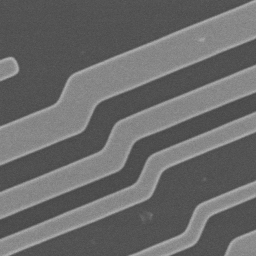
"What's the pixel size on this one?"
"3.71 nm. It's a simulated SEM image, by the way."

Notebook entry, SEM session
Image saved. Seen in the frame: groups of lines, slits or small figures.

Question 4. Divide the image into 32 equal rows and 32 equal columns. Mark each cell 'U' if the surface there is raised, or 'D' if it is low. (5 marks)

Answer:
DDDDDDDDDDDDDDDDDDDDDDDDDDDDDDDU
DDDDDDDDDDDDDDDDDDDDDDDDDDDDUUUU
DDDDDDDDDDDDDDDDDDDDDDDDDDUUUUUU
DDDDDDDDDDDDDDDDDDDDDDDUUUUUUUUU
DDDDDDDDDDDDDDDDDDDDDUUUUUUUUUUU
DDDDDDDDDDDDDDDDDDUUUUUUUUUUUUDD
DDDDDDDDDDDDDDDDUUUUUUUUUUUUDDDD
UUDDDDDDDDDDDUUUUUUUUUUUUDDDDDDD
UUDDDDDDDDDUUUUUUUUUUUUDDDDDDDDU
UUDDDDDDDUUUUUUUUUUUDDDDDDDDDUUU
DDDDDDDDUUUUUUUUUUDDDDDDDDUUUUUU
DDDDDDDDUUUUUUUUDDDDDDDDUUUUUUUU
DDDDDDDUUUUUUDDDDDDDDUUUUUUUUDDD
DDDDDDUUUUUUDDDDDDDUUUUUUUUDDDDD
DDDUUUUUUUUDDDDDUUUUUUUUDDDDDDDU
DUUUUUUUUUUDDDUUUUUUUUDDDDDDUUUU
UUUUUUUUUUDDDDUUUUUUDDDDDDUUUUUU
UUUUUUUUDDDDDUUUUDDDDDDUUUUUUDDD
UUUUUDDDDDDDDUUUDDDDDUUUUUUDDDDD
UUUDDDDDDDDUUUUUDDDUUUUUUDDDDDDD
DDDDDDDDDUUUUUUUDDUUUUDDDDDDDDDD
DDDDDDUUUUUUUUUDDDUUDDDDDDDDDDDD
DDDDUUUUUUUUDDDDDUUUDDDDDDDDDDDD
DUUUUUUUUUDDDDDDUUUDDDDDDDDDDDUU
UUUUUUUDDDDDDUUUUUUDDDDDDDDUUUUU
UUUUUDDDDDDUUUUUUDDDDDDDDUUUUUDD
UUDDDDDDUUUUUUUDDDDDDDDDUUUDDDDD
DDDDDDUUUUUUDDDDDDDDDDDDUUDDDDDD
DDDDUUUUUUDDDDDDDDDDDDDUUDDDDDDD
DUUUUUUDDDDDDDDDDDDDDDUUUDDDDDUU
UUUUUDDDDDDDDDDDDDDDUUUUDDDDDUUU
UUDDDDDDDDDDDDDDDUUUUUDDDDDDUUUU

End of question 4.